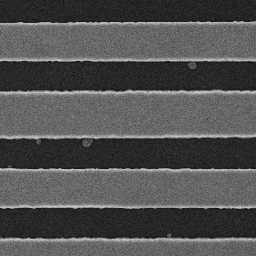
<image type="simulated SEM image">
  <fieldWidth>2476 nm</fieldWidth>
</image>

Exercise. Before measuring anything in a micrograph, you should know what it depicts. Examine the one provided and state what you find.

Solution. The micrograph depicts lines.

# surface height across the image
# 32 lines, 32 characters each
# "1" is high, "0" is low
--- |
00000000000000000000000000000000
00000000000000000000000000000000
00000000000000000000000000000000
11111111111111111111111111111111
11111111111111111111111111111111
11111111111111111111111111111111
11111111111111111111111111111111
11111111111111111111111111111111
00000000000000000000000000000000
00000000000000000000000000000000
00000000000000000000000000000000
11111111111111111111111111111111
11111111111111111111111111111111
11111111111111111111111111111111
11111111111111111111111111111111
11111111111111111111111111111111
11111111111111111111111111111111
00000000000000000000000000000000
00000000000000000000000000000000
00000000000000000000000000000000
00000000000000000000000000000000
11111111111111111111111111111111
11111111111111111111111111111111
11111111111111111111111111111111
11111111111111111111111111111111
11111111111111111111111111111111
00000000000000000000000000000000
00000000000000000000000000000000
00000000000000000000000000000000
00000000000000000000000000000000
11111111111111111111111111111111
11111111111111111111111111111111